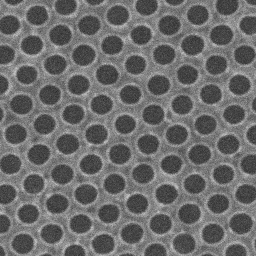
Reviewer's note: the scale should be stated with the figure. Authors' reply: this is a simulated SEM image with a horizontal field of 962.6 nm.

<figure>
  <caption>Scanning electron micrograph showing a regular array of holes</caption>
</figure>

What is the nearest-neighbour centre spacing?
0.113 microns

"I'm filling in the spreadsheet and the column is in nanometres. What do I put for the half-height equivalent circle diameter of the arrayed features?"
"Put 86.1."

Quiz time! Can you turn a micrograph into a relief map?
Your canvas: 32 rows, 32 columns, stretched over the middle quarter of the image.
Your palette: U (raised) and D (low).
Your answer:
DUUUDDUUUDDDDUUDDDDDDUUUUUUUUDDD
UUUUUUUUDDDDDDUDDDDDUUUUUUUUDDDD
UUUDUUUUDDDDDDUUDDDUUUUUUUUUDDDD
UDDDDDUUDDDDDDUUUUUUUDDDDDUUDDDD
UDDDDDDUDDDDDUUUUUUUUDDDDDDUDDDD
UDDDDDDUUUUUUUUDDDUUUDDDDDDUUUDU
UDDDDDUUUUUUUUDDDDDUUDDDDDUUUUUU
UUDDDUUUUDUUUUDDDDDDUUDDDDUUUDUU
UUUUUUUDDDDDUUDDDDDUUUUUUUUDDDDD
UUUUUUDDDDDDUUDDDDDUUUUUUUUDDDDD
UDDDUUDDDDDDUUUUUUUUUDDDUUUDDDDD
DDDDDUUDDDDDUUUUUUUUDDDDDUUDDDDD
DDDDDUUUDDDUUUUDUUUDDDDDDUUUDDDU
DDDDDUUUUUUUUDDDDUUDDDDDDUUUUUUU
DDDDUUUUUUUUDDDDDDUUDDDDDUUUUUUU
UUUUUUDDDDUUDDDDDDUUUUDUUUDDDDUU
UUUUUDDDDDDUUDDDDDUUUUUUUUDDDDDU
DDUUUDDDDDDUUUDDDUUUDDUUUDDDDDDU
DDDUUDDDDDDUUUUUUUUDDDDDUDDDDDDU
DDDDUUDDDDUUUUUUUUDDDDDDUUDDDDUU
DDDDUUUUUUUUDDDDUUDDDDDDUUUUUUUU
DDDUUUUUUUUDDDDDDUUDDDDDUUUUUUUD
DDDUUUDDUUUDDDDDDUUUDDDUUUUDUUUD
UUUUDDDDDUUDDDDDDUUUUUUUUDDDDUUD
UUUUDDDDDDUUDDDDUUUUUUUUDDDDDDUU
DDUUDDDDDDUUUUUUUUDDDDUUDDDDDDUU
DDUUDDDDDUUUUUUUUDDDDDUUDDDDDUUU
DDDUUDDDUUUDDDUUUDDDDDDUUUDDUUUU
DDUUUUUUUUDDDDDUUDDDDDDUUUUUUUDD
DDUUUUUUUUDDDDDDUUDDDDUUUUUUUUDD
UUUDDDDDUUDDDDDDUUUUUUUUDDDDUUDD
UUUDDDDDUUDDDDDUUUUUUUUDDDDDDUDD